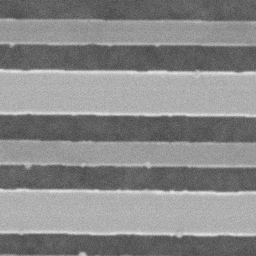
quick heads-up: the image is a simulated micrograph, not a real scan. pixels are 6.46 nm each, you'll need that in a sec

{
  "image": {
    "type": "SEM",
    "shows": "lines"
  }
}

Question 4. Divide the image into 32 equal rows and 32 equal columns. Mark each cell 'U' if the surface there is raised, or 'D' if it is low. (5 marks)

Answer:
DDDDDDDDDDDDDDDDDDDDDDDDDDDDDDDD
DDDDDDDDDDDDDDDDDDDDDDDDDDDDDDDD
UUDDDDDDDDDDDDDDDDDDDDDDDDDDDDDD
UUUUUUUUUUUUUUUUUUUUUUUUUUUUUUUU
UUUUUUUUUUUUUUUUUUUUUUUUUUUUUUUU
DDDDDDUDDDUDUUUUUUUUUUUUUUUUUUUU
DDDDDDDDDDDDDDDDDDDDDDDDDDDDDDDD
DDDDDDDDDDDDDDDDDDDDDDDDDDDDDDDD
DDDDDDDDDDDDDDDDDDDDDDDDDDDDDDDD
UUUUUUUUUUUUUUUUUUUUUUUUUUUUUUUU
UUUUUUUUUUUUUUUUUUUUUUUUUUUUUUUU
UUUUUUUUUUUUUUUUUUUUUUUUUUUUUUUU
UUUUUUUUUUUUUUUUUUUUUUUUUUUUUUUU
UUUUUUUUUUUUUUUUUUUUUUUUUUUUUUUU
DDDDDDDDDDDDDDDDDDDDDDDDDDDDDDUU
DDDDDDDDDDDDDDDDDDDDDDDDDDDDDDDD
DDDDDDDDDDDDDDDDDDDDDDDDDDDDDDDD
DDDDDDDDDDDDDDDDDDDDDDDDDDDDDDDD
UUUUUUUUUUUUUUUUUUUUUUUUUUUUUUUU
UUUUUUUUUUUUUUUUUUUUUUUUUUUUUUUU
UUUUUUUUUUUUUUUUUUUUUUUUUUUUUUUU
DDDDDDDDDDDDDDDDDDDDDDDDDDDDDDDD
DDDDDDDDDDDDDDDDDDDDDDDDDDDDDDDD
DDDDDDDDDDDDDDDDDDDDDDDDDDDDDDDD
UUUUUUUUUUUUUUUUUUUUUUUUUUUUUUUU
UUUUUUUUUUUUUUUUUUUUUUUUUUUUUUUU
UUUUUUUUUUUUUUUUUUUUUUUUUUUUUUUU
UUUUUUUUUUUUUUUUUUUUUUUUUUUUUUUU
UUUUUUUUUUUUUUUUUUUUUUUUUUUUUUUU
DDDDDDDDDDDDDDDDDDDDDDUDDDDDDDDD
DDDDDDDDDDDDDDDDDDDDDDDDDDDDDDDD
DDDDDDDDDDDDDDDDDDDDDDDDDDDDDDDD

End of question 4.